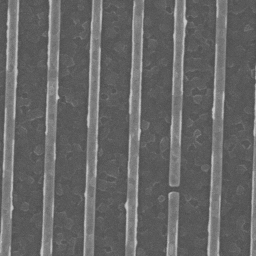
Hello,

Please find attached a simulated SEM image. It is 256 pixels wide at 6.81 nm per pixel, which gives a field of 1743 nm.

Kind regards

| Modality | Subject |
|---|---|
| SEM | parallel lines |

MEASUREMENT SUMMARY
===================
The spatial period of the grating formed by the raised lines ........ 0.283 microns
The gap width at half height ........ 211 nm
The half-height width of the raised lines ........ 70.6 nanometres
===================